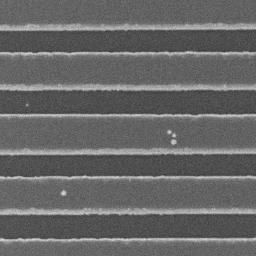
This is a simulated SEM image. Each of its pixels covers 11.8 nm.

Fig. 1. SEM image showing lines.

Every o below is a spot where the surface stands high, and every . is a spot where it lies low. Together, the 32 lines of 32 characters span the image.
oooooooooooooooooooooooooooooooo
oooooooooooooooooooooooooooooooo
oooooooooooooooooooooooooooooooo
oooooooooooooooooooooo..........
................................
................................
..............................o.
oooooooooooooooooooooooooooooooo
oooooooooooooooooooooooooooooooo
oooooooooooooooooooooooooooooooo
oooooooooooooooooooooooooooooooo
................................
................................
................................
oooooooooooooooooooooooooooooooo
oooooooooooooooooooooooooooooooo
oooooooooooooooooooooooooooooooo
oooooooooooooooooooooooooooooooo
oooooooooooooooooooooooooooooooo
................................
................................
................................
oooooooooooooooooooooooooooooooo
oooooooooooooooooooooooooooooooo
oooooooooooooooooooooooooooooooo
oooooooooooooooooooooooooooooooo
oooooooooooooooooooooo...o......
................................
................................
................................
oooooooooooooooooooooooooooooooo
oooooooooooooooooooooooooooooooo